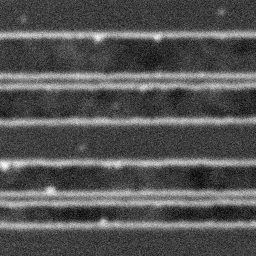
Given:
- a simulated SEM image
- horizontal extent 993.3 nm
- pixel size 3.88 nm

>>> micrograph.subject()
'lines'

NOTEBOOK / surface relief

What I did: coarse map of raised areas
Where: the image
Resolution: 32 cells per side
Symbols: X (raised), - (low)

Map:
XXXXXXXXXXXXXXXXXXXXXXXXXXXXXXXX
XXXXXXXXXXXXXXXXXXXXXXXXXXXXXXXX
XXXXXXXXXXXXXXXXXXXXXXXXXXXXXXXX
XXXXXXXXXXXXXXXXXXXXXXXXXXXXXXXX
XX----------X------X------------
--------------------------------
--------------------------------
--------------------------------
--------------------------------
XXX-XXXXXXXXXXXXXXXXXXXXXXXXXXXX
XXXXXXXXXXXXXXXXXXXXXXXXXXXXXXXX
--------------------------------
--------------------------------
--------------------------------
--------------------------------
XXXXXXXXXXXXXXXXXXXXXXXXXXXXXXXX
XXXXXXXXXXXXXXXXXXXXXXXXXXXXXXXX
XXXXXXXXXXXXXXXXXXXXXXXXXXXXXXXX
XXXXXXXXXXXXXXXXXXXXXXXXXXXXXXXX
XXXXXXXXXXXXXXXXXXXXXXXXXXXXXXXX
X------X-----XX--XX-------------
--------------------------------
--------------------------------
--------------------------------
XXXXXXXXXXXXXXXXXXXXXXXXXXXXXXXX
XXXXXXXXXXXXXXXXXX-X--XXXXX-----
--------------------------------
--------------------------------
XXXXXXXXXXXXXXXXXXXXXXXXXXXXXXXX
XXXXXXXXXXXXXXXXXXXXXXXXXXXXXXXX
XXXXXXXXXXXXXXXXXXXXXXXXXXXXXXXX
XXXXXXXXXXXXXXXXXXXXXXXXXXXXXXXX